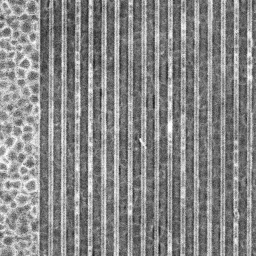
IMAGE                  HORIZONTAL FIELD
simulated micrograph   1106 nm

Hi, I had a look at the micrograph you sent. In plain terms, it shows parallel lines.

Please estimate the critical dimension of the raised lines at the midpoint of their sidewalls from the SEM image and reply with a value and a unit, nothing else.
15.1 nm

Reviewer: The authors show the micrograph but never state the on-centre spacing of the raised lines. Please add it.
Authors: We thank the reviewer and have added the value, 0.0573 um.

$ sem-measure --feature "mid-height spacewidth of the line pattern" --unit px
9.51